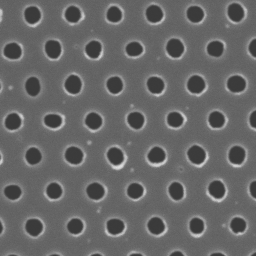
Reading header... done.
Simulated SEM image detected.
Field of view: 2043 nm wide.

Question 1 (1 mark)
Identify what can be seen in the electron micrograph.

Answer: a regular array of holes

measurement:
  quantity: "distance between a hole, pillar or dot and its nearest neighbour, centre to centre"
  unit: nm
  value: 318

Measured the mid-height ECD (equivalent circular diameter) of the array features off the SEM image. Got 133 nanometers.